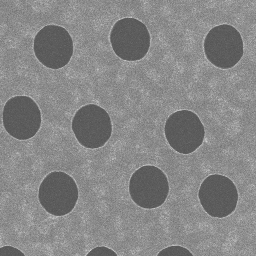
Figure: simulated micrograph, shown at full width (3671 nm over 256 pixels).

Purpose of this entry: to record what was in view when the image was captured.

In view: a regular array of holes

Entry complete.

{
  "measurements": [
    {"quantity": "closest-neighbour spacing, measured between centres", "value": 1020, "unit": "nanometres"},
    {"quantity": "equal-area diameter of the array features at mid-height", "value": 594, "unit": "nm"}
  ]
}